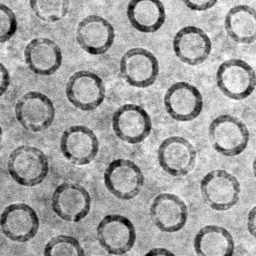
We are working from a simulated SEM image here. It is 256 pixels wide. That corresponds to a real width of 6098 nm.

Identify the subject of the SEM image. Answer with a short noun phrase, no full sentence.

a regular array of ring-shaped grooves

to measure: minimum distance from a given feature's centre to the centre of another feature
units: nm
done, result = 1310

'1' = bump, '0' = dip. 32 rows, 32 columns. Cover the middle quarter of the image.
11111111111111001111110011111111
11110011111111001111110011111111
11000000111111001111110011111111
10001100011111100111100111111111
10011111001111100000000111110001
00111111001111111000001111000000
00111111001111111111111111000100
00011111001111111111111110011111
10011111001111111111111110011111
10000100001111111111111110011111
11000000011111000001111110011111
11110001111110000000111110001111
11111111111100011110011111000000
11111111111100111110001111100000
11111111111100111111001111111001
10000011111100111111001111111111
00000001111100111111001111111111
00111000111110011110001111111111
01111100111111000000011110000011
01111110011111100001111100000000
01111110011111111111111100111100
01111110011111111111111000111110
00111100111111111111111001111110
00000000111111111111111001111110
10000001111100000111111100111110
11111111111000000001111100111100
11111111110001111001111110000000
11111111110011111100111111000001
11111111110011111100111111111111
00011111110011111100111111111111
00000111110011111100111111111111
01100011111001111000111111111111